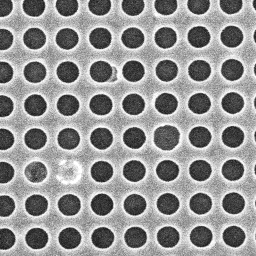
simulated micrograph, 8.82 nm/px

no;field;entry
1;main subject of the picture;a regular array of holes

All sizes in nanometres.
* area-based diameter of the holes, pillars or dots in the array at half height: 204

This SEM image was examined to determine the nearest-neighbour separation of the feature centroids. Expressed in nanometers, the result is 288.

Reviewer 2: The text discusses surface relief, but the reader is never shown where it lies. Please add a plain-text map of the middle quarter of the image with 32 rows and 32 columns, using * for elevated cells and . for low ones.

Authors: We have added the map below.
...****.....***.....***......**.
....**......**......***......**.
....**......**......***......**.
...****.....***.....****....****
..******..******...******.******
********************************
********************************
..*******.*******..*****...*****
...****....****.....***.....***.
....**......**......***......**.
....**......**......***.....***.
....***.....***.....***.....***.
...*****...*****...*****...*****
********************************
********************************
************************...*****
...****.....****....***......***
....***.....***.....**.......**.
....**......***......*.......**.
....***.....***.....**.......**.
....***.....****....***.....****
..*******.**************...*****
********************************
********************************
********...*****...*****....****
*******.....***.....***......**.
******......***......**......**.
******......***.....***......**.
*******.....***.....****....****
********..*******..*************
********************************
********************************